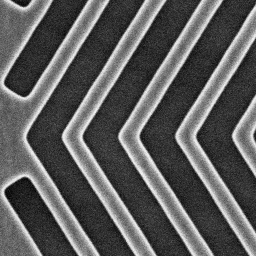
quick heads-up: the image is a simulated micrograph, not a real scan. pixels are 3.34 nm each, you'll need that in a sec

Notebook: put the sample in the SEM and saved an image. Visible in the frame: groups of lines, slits or small figures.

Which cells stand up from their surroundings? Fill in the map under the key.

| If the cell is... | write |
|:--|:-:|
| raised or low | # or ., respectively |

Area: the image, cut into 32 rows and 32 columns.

##..##.....##.....##.....###....
######....###....###....###....#
#####.....##.....##.....##.....#
####.....###....###....###....##
####....###....###....###.....##
###.....##.....##.....##.....##.
###....###....###....###....###.
##....###.....##.....##.....##..
#.....##.....##.....##.....###..
#....###....###....###....###...
#....##.....##.....##.....##....
##..##.....###....###....###....
######....###....###.....##.....
#####.....##.....##.....##.....#
#####....###....###....###....##
####.....##.....##.....##.....##
###.....##.....###....###....###
###.....##.....##.....###....###
####....###....###.....##.....##
#####....###....###....###....##
#####.....##.....##.....##.....#
######....###....###.....##.....
##..##.....##.....###....###....
#....##.....##.....##.....##....
#....###....###....###....###...
#.....##.....##.....##.....###..
##....###.....##.....##.....##..
###....###....###....###....###.
###.....##.....##.....##.....###
####....###....###.....##.....##
####.....###....###....###....##
#####.....##.....##.....##.....#